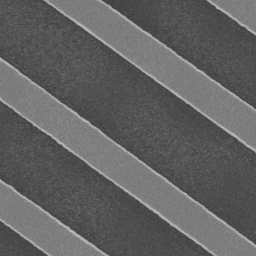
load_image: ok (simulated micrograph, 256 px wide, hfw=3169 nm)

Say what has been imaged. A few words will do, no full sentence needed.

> lines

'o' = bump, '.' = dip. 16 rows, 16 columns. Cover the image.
...oooo.......oo
.....ooo.......o
......oooo......
........ooo.....
o........oooo...
ooo.......oooo..
oooo........oooo
..ooo........ooo
...oooo........o
....oooo........
......ooo.......
.......oooo.....
oo.......ooo....
ooo.......oooo..
.oooo......oooo.
..oooo.......ooo